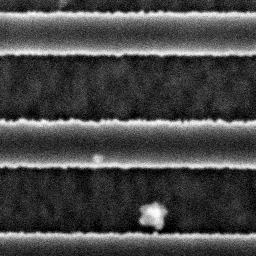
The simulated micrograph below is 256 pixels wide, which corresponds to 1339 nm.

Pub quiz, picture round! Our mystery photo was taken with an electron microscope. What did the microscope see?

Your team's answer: lines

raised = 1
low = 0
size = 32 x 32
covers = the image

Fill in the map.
00000000000000000000000000000000
00000000000000000000000000000000
11111111111111111111111111111111
11111111111111111111111111111111
11111111111111111111111111111111
11111111111111111111111111111111
11111111111111111111111111111111
00000000000000000000000000000000
00000000000000000000000000000000
00000000000000000000000000000000
00000000000000000000000000000000
00000000000000000000000000000000
00000000000000000000000000000000
00000000000000000000000000000000
00000000000000000000000000000000
11111111111111111111111111111111
11111111111111111111111111111111
11111111111111111111111111111111
11111111111111111111111111111111
11111111111111111111111111111111
11111111111111111111111111111111
00000000000000000000000000000000
00000000000000000000000000000000
00000000000000000000000000000000
00000000000000000000000000000000
00000000000000000000000000000000
00000000000000000011100000000000
00000000000000000011000000000000
00000000000000000000000000000000
11111111111111111111111111111111
11111111111111111111111111111111
11111111111111111111111111111111